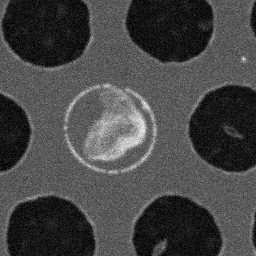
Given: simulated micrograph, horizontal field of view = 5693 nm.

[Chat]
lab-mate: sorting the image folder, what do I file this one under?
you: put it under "holes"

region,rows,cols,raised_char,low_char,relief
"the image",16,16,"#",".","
......##.....###
......##.....###
......##.....###
#....####...####
################
##############..
.###########....
..##########....
..##########....
..##########....
.#############..
################
##..######..####
#....####....###
......##......##
......##......##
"